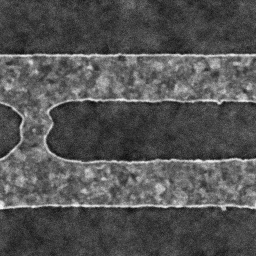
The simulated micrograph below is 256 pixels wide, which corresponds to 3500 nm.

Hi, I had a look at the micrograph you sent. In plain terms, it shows one or a few lines or trenches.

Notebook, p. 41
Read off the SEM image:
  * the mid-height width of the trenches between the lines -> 812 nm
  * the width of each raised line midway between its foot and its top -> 631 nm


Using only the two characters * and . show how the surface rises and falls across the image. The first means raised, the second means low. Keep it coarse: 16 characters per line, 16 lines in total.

................
................
................
****************
****************
****************
****............
.**.............
.**.............
.**.............
****************
****************
****************
................
................
................